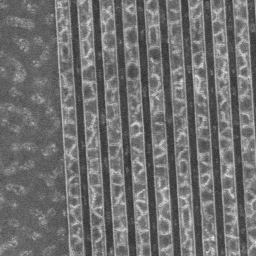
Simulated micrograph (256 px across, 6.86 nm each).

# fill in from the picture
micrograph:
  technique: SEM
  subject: parallel lines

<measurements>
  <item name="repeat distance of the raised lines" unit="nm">152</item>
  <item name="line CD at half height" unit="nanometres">98.4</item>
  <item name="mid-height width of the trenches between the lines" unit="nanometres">53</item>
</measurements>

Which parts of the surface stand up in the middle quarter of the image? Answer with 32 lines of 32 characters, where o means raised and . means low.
oo..oooo..ooo..oooo..ooo...ooo..
oo...ooo..ooo...ooo..ooo...ooo..
oo...ooo..ooo...ooo..ooo...ooo..
oo...ooo..oooo..ooo..oooo..ooo..
oo...ooo..oooo..ooo..oooo..ooo..
oo...ooo..oooo..ooo..oooo..ooo..
ooo..ooo..ooo...ooo..oooo..ooo..
ooo..ooo..oooo..ooo..oooo..ooo..
ooo..ooo..oooo..ooo..oooo..ooo..
ooo..ooo..oooo..ooo...ooo..ooo..
ooo..ooo...ooo..ooo...ooo..ooo..
ooo..ooo...ooo..oooo..ooo..oooo.
ooo..oooo..ooo..oooo..ooo..oooo.
ooo..oooo..ooo..oooo..ooo..oooo.
ooo..ooo...ooo..oooo..ooo...ooo.
ooo..oooo..ooo..oooo..ooo...ooo.
ooo..oooo..ooo..oooo..ooo..oooo.
ooo..oooo..ooo..oooo..ooo...ooo.
ooo...ooo..ooo...ooo..ooo...ooo.
ooo...ooo..ooo...ooo..ooo...ooo.
ooo...ooo..oooo..ooo..oooo..ooo.
ooo...ooo..oooo..ooo..oooo..ooo.
ooo...ooo..oooo..ooo..oooo..ooo.
ooo...ooo..oooo..ooo..oooo..ooo.
oooo..ooo..oooo..ooo..oooo..ooo.
oooo..ooo..oooo..ooo..oooo..ooo.
.ooo..ooo...ooo..ooo...ooo..ooo.
.ooo..ooo...ooo..ooo...ooo..ooo.
.ooo..oooo..ooo..oooo..ooo..oooo
.ooo..oooo..ooo..oooo..ooo..oooo
.ooo..oooo..ooo..oooo..ooo...ooo
.ooo..oooo..ooo..oooo..ooo...ooo